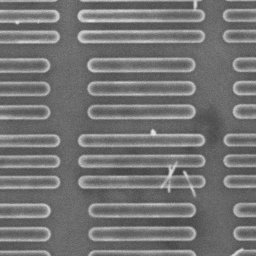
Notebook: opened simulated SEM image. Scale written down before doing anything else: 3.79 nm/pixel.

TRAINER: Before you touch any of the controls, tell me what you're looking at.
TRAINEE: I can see groups of lines, slits or small figures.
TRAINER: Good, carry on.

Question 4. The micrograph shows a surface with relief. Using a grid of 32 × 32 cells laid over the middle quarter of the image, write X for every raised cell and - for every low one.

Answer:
------XXXXXXXXXXXXXXXXXXXXXXXXXX
-------XXXXXXXXXXXXXXXXXXXXXXXXX
--------------------------------
--------------------------------
--------------------------------
------XXXXXXXXXXXXXXXXXXXXXXXXXX
------XXXXXXXXXXXXXXXXXXXXXXXXXX
-------XXXXXXXXXXXXXXXXXXXXXXXXX
--------------------------------
--------------------------------
--------------------XXXXXXXXXXXX
------XXXXXXXXXXXXXXXXXXXXXXXXXX
------XXXXXXXXXXXXXXXXXXXXXXXXXX
-------XXXXXXXXXXXXXXXXXX-------
--------------------------------
--------------------------------
--------------------------------
---------------------XX---------
----XXXXXXXXXXXXXXXXXXXXXXXXXXXX
----XXXXXXXXXXXXXXXXXXXXXXXXXXXX
----XXXXXXXXXXXXXXXXXXXXXXXXXX--
--------------------------------
--------------------------------
----XXXXXXXXXXXXXXXXXXXXXXXXXXXX
----XXXXXXXXXXXXXXXXXXXXXXXXXXXX
----XXXXXXXXXXXXXXXXXXXXXXXXXXXX
--------------------------X-----
--------------------------X---X-
----XXXXXXXXXXXXXXXXXXXXXXXXXXXX
----XXXXXXXXXXXXXXXXXXXXXXXXXXXX
----XXXXXXXXXXXXXXXXXXXXXXXXXXXX
--------------------------------